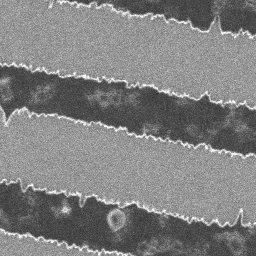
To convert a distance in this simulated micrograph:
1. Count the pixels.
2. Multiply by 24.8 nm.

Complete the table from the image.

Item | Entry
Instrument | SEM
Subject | one or a few lines or trenches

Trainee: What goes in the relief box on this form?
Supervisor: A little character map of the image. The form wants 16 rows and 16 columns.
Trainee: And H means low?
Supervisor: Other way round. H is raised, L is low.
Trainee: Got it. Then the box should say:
LLLLLLLHHHHHHHHH
LLLLLLLLLLLLHHHH
LLLLLLLLLLLLLLLL
LLLLLLLLLLLLLLLL
HHHLLLLLLLLLLLLL
HHHHHHHHHHLLLLLL
HHHHHHHHHHHHHHHL
LLLLHHHHHHHHHHHH
LLLLLLLLLLHHHHHH
LLLLLLLLLLLLLLHH
LLLLLLLLLLLLLLLL
HLLLLLLLLLLLLLLL
HHHHHHLLLLLLLLLL
HHHHHHHHHHHLLLLL
HHHHHHHHHHHHHHHH
LLLLLHHHHHHHHHHH